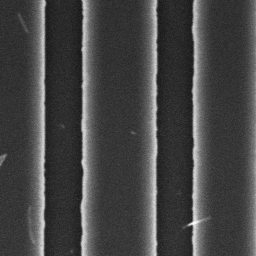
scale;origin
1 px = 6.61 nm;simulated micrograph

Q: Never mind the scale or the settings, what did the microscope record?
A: lines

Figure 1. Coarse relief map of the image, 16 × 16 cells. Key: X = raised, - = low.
XXX--XXXXX--XXXX
XXX--XXXXX--XXXX
XXX--XXXXX--XXXX
XXX--XXXXX--XXXX
XXX--XXXXX--XXXX
XXX--XXXXX--XXXX
XXX--XXXXX--XXXX
XXX--XXXXX--XXXX
XXX--XXXXX--XXXX
XXX--XXXXX--XXXX
XXX--XXXXX--XXXX
XXX--XXXXX--XXXX
XXX--XXXXX--XXXX
XXX--XXXXX--XXXX
XXX--XXXXX--XXXX
XXX--XXXXX--XXXX